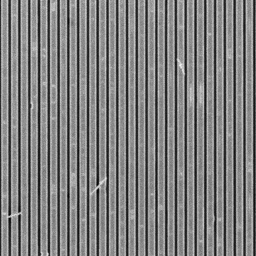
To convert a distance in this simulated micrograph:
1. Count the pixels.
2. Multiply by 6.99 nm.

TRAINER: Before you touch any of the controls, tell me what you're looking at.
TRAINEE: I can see parallel lines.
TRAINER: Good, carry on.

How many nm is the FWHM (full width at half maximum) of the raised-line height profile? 50.7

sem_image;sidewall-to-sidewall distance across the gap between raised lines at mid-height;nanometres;19.2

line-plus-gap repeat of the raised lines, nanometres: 68.4